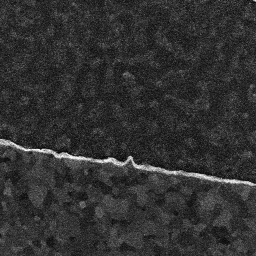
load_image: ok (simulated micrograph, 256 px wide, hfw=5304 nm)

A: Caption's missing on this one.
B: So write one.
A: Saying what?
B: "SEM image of one or a few lines or trenches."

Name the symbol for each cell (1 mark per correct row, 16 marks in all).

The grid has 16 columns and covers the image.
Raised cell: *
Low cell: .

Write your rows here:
................
................
................
................
................
................
................
................
................
***.............
**********......
****************
****************
****************
****************
****************